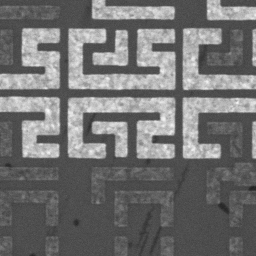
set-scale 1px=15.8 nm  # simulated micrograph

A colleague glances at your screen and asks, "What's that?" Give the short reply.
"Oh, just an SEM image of wiring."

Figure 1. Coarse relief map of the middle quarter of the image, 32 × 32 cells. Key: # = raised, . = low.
.###...................#####..##
.###....................####..##
.####...................####..##
.###########################..##
.###########################..##
.###########################..##
................................
................................
................................
.###########################..##
.###########################..##
.###########################..##
.###....................####..##
.###....................####..##
.###..............##########..##
.###...#########..##########..##
.###...#########..##########..##
.###........####..#########...##
.###.........###..####........##
.####........###..####........##
.#########...###..#########...##
.#########...###..#########...##
.#########...###..#########...##
................................
................................
................................
.......####################.....
.......####################.....
.......####################.....
.......###......................
.......###......................
.......###......................